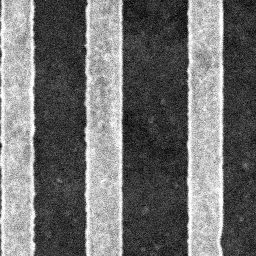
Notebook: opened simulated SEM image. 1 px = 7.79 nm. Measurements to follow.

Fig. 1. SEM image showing one or a few lines or trenches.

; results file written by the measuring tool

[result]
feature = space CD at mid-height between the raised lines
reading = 487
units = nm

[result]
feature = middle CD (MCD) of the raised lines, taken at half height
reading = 249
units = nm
